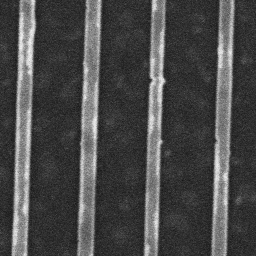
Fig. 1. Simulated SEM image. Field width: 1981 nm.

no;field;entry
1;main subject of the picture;one or a few lines or trenches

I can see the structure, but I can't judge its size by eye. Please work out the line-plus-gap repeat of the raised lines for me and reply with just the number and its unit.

514 nanometres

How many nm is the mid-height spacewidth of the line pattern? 409